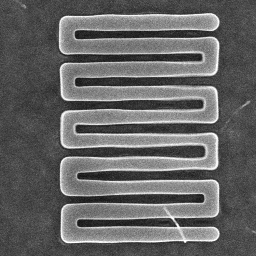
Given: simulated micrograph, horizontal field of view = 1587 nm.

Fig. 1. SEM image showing groups of lines, slits or small figures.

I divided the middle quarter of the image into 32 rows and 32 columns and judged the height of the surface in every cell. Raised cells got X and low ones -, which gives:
XXXXXXXXXXXXXXXXXXXXXXXXXXXXXXXX
XXXXXXXXXXXXXXXXXXXXXXXXXXXXXXXX
XXXXXXXXXXXXXXXXXXXXXXXXXXXXXXXX
XXX-----------------------------
XXX-----------------------------
XXX-----------------------------
XXXXXXXXXXXXXXXXXXXXXXXXXXXXXXXX
XXXXXXXXXXXXXXXXXXXXXXXXXXXXXXXX
XXXXXXXXXXXXXXXXXXXXXXXXXXXXXXX-
--------------------------------
--------------------------------
--------XXXXXX------------------
XXXXXXXXXXXXXXXXXXXXXXXXXXXXXXXX
XXXXXXXXXXXXXXXXXXXXXXXXXXXXXXXX
XXXXXXXXXXXXXXXXXXXXXXXXXXXXXXXX
XXX-----------------------------
XXX-----------------------------
XXXXXXXXXX----------------------
XXXXXXXXXXXXXXXXXXXXXXXXXXXXXXXX
XXXXXXXXXXXXXXXXXXXXXXXXXXXXXXXX
XXXXXXXXXXX-XXXXXXXXXX----------
--------------------------------
--------------------------------
XXXXXXXX-------XXXXXXXXXX-------
XXXXXXXXXXXXXXXXXXXXXXXXXXXXXXXX
XXXXXXXXXXXXXXXXXXXXXXXXXXXXXXXX
XXXXXXXXXX----------------------
XXX-----------------------------
XXX-----------------------------
XXXXXXXXXXXXXXXXXXXXXXXXXXXXXXXX
XXXXXXXXXXXXXXXXXXXXXXXXXXXXXXXX
XXXXXXXXXXXXXXXXXXXXXXXXXXXXXXXX